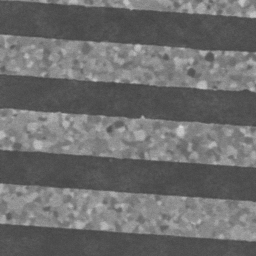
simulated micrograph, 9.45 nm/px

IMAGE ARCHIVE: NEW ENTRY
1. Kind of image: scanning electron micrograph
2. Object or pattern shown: one or a few lines or trenches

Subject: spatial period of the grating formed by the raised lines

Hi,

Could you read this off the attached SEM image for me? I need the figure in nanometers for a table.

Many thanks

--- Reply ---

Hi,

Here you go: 702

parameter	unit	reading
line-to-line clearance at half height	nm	331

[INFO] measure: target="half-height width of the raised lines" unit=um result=0.37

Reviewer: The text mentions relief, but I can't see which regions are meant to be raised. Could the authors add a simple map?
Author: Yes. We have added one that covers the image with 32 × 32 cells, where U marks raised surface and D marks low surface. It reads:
DDDDDDDDUUUUUUUUUUUUUUUUUUUUUUUU
DDDDDDDDDDDDDDDDDDDDDDUUUUUUUUUU
DDDDDDDDDDDDDDDDDDDDDDDDDDDDDDDD
DDDDDDDDDDDDDDDDDDDDDDDDDDDDDDDD
UUDDDDDDDDDDDDDDDDDDDDDDDDDDDDDD
UUUUUUUUUUUUUUUDDDDDDDDDDDDDDDDD
UUUUUUUUUUUUUUUUUUUUUUUUUUUUUUDD
UUUUUUUUUUUUUUUUUUUUUUUUUUUUUUUU
UUUUUUUUUUUUUUUUUUUUUUUUUUUUUUUU
DDDDUUUUUUUUUUUUUUUUUUUUUUUUUUUU
DDDDDDDDDDDDDDDDDDUUUUUUUUUUUUUU
DDDDDDDDDDDDDDDDDDDDDDDDDDDDDDDD
DDDDDDDDDDDDDDDDDDDDDDDDDDDDDDDD
DDDDDDDDDDDDDDDDDDDDDDDDDDDDDDDD
UUUUUUUUUUUUUDDDDDDDDDDDDDDDDDDD
UUUUUUUUUUUUUUUUUUUUUUUUUUDDDDDD
UUUUUUUUUUUUUUUUUUUUUUUUUUUUUUUU
UUUUUUUUUUUUUUUUUUUUUUUUUUUUUUUU
UUUUUUUUUUUUUUUUUUUUUUUUUUUUUUUU
DDDDDDDDDDDDUUUUUUUUUUUUUUUUUUUU
DDDDDDDDDDDDDDDDDDDDDDDDDDDUUUUU
DDDDDDDDDDDDDDDDDDDDDDDDDDDDDDDD
DDDDDDDDDDDDDDDDDDDDDDDDDDDDDDDD
UUUUUUDDDDDDDDDDDDDDDDDDDDDDDDDD
UUUUUUUUUUUUUUUUUUUUUUDDDDDDDDDD
UUUUUUUUUUUUUUUUUUUUUUUUUUUUUUUU
UUUUUUUUUUUUUUUUUUUUUUUUUUUUUUUU
UUUUUUUUUUUUUUUUUUUUUUUUUUUUUUUU
DDDDDDDDUUUUUUUUUUUUUUUUUUUUUUUU
DDDDDDDDDDDDDDDDDDDDDDDUUUUUUUUU
DDDDDDDDDDDDDDDDDDDDDDDDDDDDDDDD
DDDDDDDDDDDDDDDDDDDDDDDDDDDDDDDD